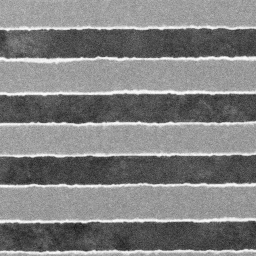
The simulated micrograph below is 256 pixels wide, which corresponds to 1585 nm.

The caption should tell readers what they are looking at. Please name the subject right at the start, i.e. lines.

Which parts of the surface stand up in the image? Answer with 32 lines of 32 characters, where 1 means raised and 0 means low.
11111111111111111111111111111111
11111111111111111111111111111111
11111111111111111111111111111111
11111111111111111111111010101111
00000000000000000000000000000000
00000000000000000000000000000000
00000000000000000000000000000000
11110000111111111111111111111111
11111111111111111111111111111111
11111111111111111111111111111111
11111111111111111111111111111111
11111111111111100111111111111111
00000000000000000000000000000000
00000000000000000000000000000000
00000000000000000000000000000000
11111111111111111111111111111111
11111111111111111111111111111111
11111111111111111111111111111111
11111111111111111111111111111111
00101000000000000000000000000000
00000000000000000000000000000000
00000000000000000000000000000000
00000000000000000000000000000000
11111111111111111111111111111111
11111111111111111111111111111111
11111111111111111111111111111111
11111111111111111111111111111111
11111111111111111111111111110110
00000000000000000000000000000000
00000000000000000000000000000000
00000000000000000000000000000000
11100000111111111111111111111111